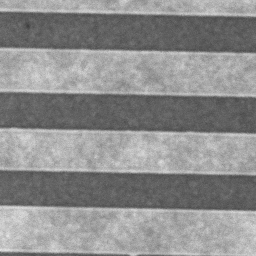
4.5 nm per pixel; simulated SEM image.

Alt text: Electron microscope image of one or a few lines or trenches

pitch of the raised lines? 357 nm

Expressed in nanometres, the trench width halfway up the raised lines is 175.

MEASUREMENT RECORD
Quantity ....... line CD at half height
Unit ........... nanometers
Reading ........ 184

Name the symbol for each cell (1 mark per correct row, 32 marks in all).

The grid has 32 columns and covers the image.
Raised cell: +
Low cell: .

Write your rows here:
++++++++++++++++++++++++++++++++
............++.+++++++++++++++++
................................
................................
................................
................................
+++++++++++++...................
++++++++++++++++++++++++++++++++
++++++++++++++++++++++++++++++++
++++++++++++++++++++++++++++++++
++++++++++++++++++++++++++++++++
.............+++++++++++++++++++
................................
................................
................................
................................
++++++++.++++...................
++++++++++++++++++++++++++++++++
++++++++++++++++++++++++++++++++
++++++++++++++++++++++++++++++++
++++++++++++++++++++++++++++++++
........................++++++++
................................
................................
................................
................................
+++++++++++++++++++++++++.++....
++++++++++++++++++++++++++++++++
++++++++++++++++++++++++++++++++
++++++++++++++++++++++++++++++++
++++++++++++++++++++++++++++++++
..............++++++++++++++++++